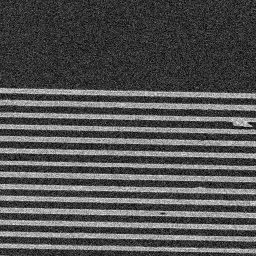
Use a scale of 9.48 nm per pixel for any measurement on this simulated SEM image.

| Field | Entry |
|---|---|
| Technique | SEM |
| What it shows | parallel lines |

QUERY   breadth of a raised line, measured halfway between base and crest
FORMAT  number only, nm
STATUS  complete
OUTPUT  42.6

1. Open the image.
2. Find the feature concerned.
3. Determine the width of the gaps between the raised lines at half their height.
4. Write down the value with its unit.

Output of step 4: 68.7 nm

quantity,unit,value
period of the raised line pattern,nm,113